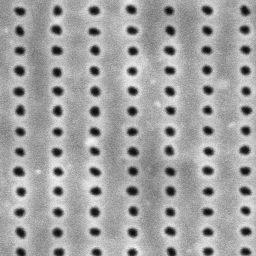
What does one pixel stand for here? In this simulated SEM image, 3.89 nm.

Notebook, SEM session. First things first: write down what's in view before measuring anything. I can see a regular array of holes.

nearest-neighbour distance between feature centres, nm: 76.8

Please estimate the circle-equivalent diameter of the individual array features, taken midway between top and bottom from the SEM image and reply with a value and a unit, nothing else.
40.6 nanometers